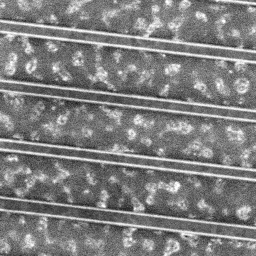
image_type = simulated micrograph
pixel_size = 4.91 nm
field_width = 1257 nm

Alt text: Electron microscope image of parallel lines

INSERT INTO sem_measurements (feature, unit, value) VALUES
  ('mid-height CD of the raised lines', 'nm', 50.6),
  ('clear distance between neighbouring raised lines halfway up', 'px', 48.4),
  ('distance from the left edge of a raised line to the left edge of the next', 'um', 0.288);